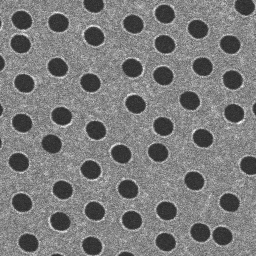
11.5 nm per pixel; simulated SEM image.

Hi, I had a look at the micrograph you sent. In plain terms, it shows a regular array of holes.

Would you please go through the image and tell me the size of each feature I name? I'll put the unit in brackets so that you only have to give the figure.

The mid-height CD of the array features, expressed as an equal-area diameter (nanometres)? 226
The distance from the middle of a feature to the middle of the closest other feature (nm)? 383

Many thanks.